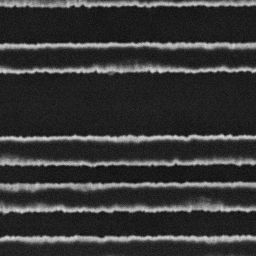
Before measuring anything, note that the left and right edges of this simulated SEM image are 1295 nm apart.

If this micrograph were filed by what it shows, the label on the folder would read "lines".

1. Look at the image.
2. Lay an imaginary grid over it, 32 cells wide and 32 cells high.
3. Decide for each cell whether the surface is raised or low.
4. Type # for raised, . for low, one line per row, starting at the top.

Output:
################################
................................
................................
................................
................................
........#..####.####..##.#.#...#
################################
################################
################################
................................
................................
................................
................................
................................
................................
................................
................................
################################
################################
################################
....##.########.########........
................................
................................
################################
################################
################################
................................
................................
................................
................................
################################
################################